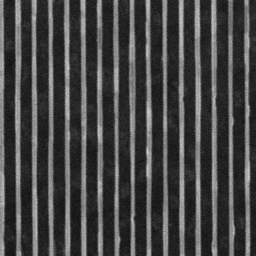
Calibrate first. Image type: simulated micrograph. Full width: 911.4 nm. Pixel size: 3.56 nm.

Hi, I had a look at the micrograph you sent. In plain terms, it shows parallel lines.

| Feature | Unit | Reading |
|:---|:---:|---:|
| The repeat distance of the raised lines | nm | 58.2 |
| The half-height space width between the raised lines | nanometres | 45.4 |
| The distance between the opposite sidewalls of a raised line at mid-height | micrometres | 0.0125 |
